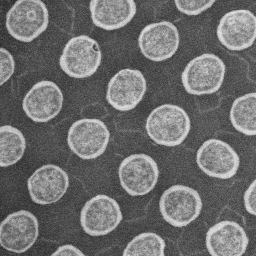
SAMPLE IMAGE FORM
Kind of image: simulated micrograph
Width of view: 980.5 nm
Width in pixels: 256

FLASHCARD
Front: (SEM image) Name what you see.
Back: a regular array of raised bodies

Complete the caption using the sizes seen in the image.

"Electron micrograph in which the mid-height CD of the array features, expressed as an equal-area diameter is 145 nm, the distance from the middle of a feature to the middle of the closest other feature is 214 nm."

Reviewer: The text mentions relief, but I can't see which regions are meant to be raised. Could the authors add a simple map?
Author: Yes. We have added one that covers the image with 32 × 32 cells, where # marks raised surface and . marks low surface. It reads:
..###.......#####.....####......
.#####......#####......##....##.
.#####......####............####
.####........#....####.....#####
..##..............####.....#####
.........###......####......###.
#.......####......####..........
##......####............###.....
##......####...........#####....
#........#....####.....#####....
.....##.......####.....#####....
....####......####......##......
...#####......###.............##
...#####.......#....##.......###
....###............####......###
.........####.....######.....###
##.......####......####.......##
###......####......####.........
###......####............####...
###.......##.............####...
#..............####......#####..
....####.......#####......###...
....####.......####.............
....####........###...#........#
....####.............####......#
...........###......#####......#
..........#####.....#####......#
.###......#####......###........
#####......###.............###..
#####.............##......####..
####............####......#####.
..#....###......####......####..